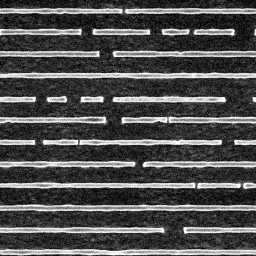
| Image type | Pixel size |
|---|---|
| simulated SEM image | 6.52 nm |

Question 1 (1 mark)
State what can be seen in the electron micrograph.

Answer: parallel lines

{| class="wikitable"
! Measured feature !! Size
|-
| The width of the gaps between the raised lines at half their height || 0.109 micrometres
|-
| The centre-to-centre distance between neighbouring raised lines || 143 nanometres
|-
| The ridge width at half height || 34.2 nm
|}